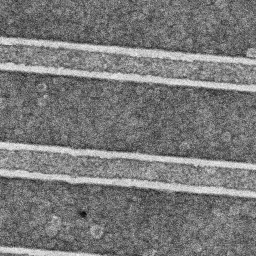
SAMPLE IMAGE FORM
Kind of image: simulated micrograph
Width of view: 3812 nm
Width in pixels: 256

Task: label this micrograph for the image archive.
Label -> one or a few lines or trenches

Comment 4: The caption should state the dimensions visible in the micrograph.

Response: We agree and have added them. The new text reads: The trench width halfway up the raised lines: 1160 nanometers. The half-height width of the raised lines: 27.3 pixels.